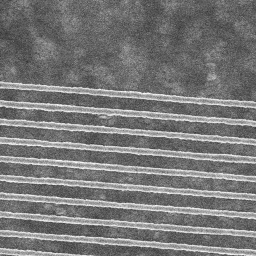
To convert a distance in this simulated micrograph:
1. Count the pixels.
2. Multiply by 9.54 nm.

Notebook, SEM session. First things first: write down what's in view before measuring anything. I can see parallel lines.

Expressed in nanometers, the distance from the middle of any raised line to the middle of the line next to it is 176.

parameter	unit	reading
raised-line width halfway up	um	0.0582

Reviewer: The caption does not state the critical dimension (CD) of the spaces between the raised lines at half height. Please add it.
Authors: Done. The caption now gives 118 nanometres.